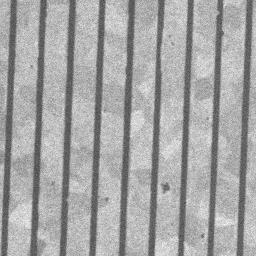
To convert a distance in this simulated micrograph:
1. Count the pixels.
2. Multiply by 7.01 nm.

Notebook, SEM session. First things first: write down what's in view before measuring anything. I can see parallel lines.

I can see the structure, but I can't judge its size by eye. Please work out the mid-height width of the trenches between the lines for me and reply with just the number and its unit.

50.8 nm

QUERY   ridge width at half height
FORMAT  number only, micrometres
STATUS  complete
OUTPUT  0.153